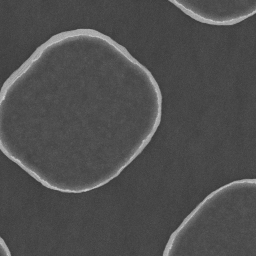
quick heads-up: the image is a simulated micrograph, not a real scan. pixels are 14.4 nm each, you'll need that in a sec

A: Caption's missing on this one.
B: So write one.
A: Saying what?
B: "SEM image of raised bodies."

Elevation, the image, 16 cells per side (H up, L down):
LLLLLLLLLLLHHHHH
LLLLLLLLLLLLLLLL
LLLHHHHLLLLLLLLL
LLHHHHHHLLLLLLLL
LHHHHHHHHLLLLLLL
HHHHHHHHHHLLLLLL
HHHHHHHHHHLLLLLL
HHHHHHHHHHLLLLLL
HHHHHHHHHLLLLLLL
HHHHHHHHHLLLLLLL
LHHHHHHHLLLLLLLL
LLLHHHLLLLLLLLHH
LLLLLLLLLLLLLHHH
LLLLLLLLLLLLHHHH
LLLLLLLLLLLHHHHH
LLLLLLLLLLHHHHHH